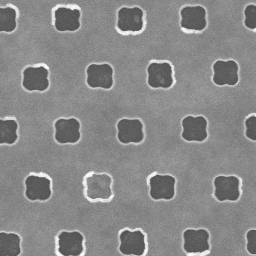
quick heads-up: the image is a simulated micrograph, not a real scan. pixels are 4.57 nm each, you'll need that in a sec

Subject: a regular array of holes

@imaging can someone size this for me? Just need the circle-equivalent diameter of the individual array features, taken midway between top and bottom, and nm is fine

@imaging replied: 121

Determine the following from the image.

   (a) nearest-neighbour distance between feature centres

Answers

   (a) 288 nm